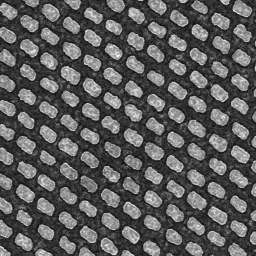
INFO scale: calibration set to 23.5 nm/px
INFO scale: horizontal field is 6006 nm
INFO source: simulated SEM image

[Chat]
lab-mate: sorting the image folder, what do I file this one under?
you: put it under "a regular array of raised bodies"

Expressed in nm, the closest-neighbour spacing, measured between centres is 554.